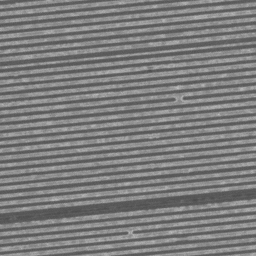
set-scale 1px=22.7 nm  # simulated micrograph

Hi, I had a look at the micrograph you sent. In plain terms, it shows parallel lines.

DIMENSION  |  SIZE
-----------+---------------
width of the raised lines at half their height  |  79.2 nanometers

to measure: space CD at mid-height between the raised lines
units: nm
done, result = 96.2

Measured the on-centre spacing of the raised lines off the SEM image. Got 172 nm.